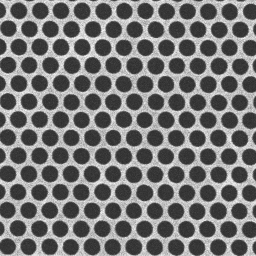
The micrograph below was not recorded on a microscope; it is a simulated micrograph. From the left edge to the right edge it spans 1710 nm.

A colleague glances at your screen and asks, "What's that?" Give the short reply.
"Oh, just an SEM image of a regular array of holes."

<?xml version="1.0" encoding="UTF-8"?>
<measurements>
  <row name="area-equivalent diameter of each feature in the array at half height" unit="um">0.11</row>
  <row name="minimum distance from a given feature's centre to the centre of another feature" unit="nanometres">138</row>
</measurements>